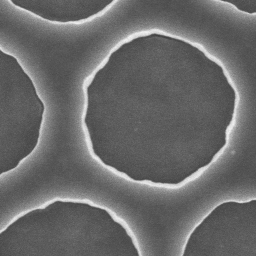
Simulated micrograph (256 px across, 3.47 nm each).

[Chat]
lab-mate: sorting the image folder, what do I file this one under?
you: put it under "holes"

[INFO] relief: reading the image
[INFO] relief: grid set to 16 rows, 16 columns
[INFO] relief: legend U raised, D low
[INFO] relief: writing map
UDDDDDDUUUUUUUUD
UUUUUUUUUUUUUUUU
UUUUUUUUDDDUUUUU
DUUUUUUDDDDDDUUU
DDUUUUDDDDDDDDUU
DDUUUDDDDDDDDDDU
DDDUUDDDDDDDDDDU
DDDUUDDDDDDDDDDU
DDUUUDDDDDDDDDUU
DDUUUUDDDDDDDDUU
DUUUUUUDDDDDDUUU
UUUUUUUUUUDUUUUU
UUUUUUUUUUUUUUUU
UDDDDDDUUUUUUDDD
DDDDDDDDUUUUDDDD
DDDDDDDDDUUUDDDD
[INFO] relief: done